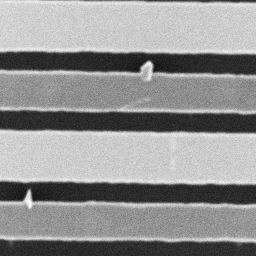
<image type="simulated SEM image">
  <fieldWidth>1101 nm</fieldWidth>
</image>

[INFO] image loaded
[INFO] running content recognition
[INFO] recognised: lines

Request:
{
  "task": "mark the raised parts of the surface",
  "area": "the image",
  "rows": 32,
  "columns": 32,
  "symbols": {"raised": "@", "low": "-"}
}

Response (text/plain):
@@@@@@@@@@@@@@@@@@@@@@@@@@@@@@@@
@@@@@@@@@@@@@@@@@@@@@@@@@@@@@@@@
@@@@@@@@@@@@@@@@@@@@@@@@@@@@@@@@
@@@@@@@@@@@@@@@@@@@@@@@@@@@@@@@@
@@@@@@@@@@@@@@@@@@@@@@@@@@@@@@@@
@@@@@@@@@@@@@@@@@@@@@@@@@@@@@@@@
--------------@@@-@@@@@@@@@@@@@@
--------------------------------
------------------@-------------
@@@@@@@@@@@@@@@@@@@@@@@@@@@@@@@@
@@@@@@@@@@@@@@@@@@@@@@@@@@@@@@@@
@@@@@@@@@@@@@@@@@@@@@@@@@@@@@@@@
@@@@@@@@@@@@@@@@@@@@@@@@@@@@@@@@
@@@@@@@@@@@@@@@@@@@@@@@@@@@@@@@@
--------------------------------
--------------------------------
@@@@@@@@@@----------------------
@@@@@@@@@@@@@@@@@@@@@@@@@@@@@@@@
@@@@@@@@@@@@@@@@@@@@@@@@@@@@@@@@
@@@@@@@@@@@@@@@@@@@@@@@@@@@@@@@@
@@@@@@@@@@@@@@@@@@@@@@@@@@@@@@@@
@@@@@@@@@@@@@@@@@@@@@@@@@@@@@@@@
@@@@@@@@@@@@@@@@@@@@@@@@@@@@@@@@
--------------------------------
---@----------------------------
@@@@@@@@@@@@@@@@@@@@@@@@@@@@@---
@@@@@@@@@@@@@@@@@@@@@@@@@@@@@@@@
@@@@@@@@@@@@@@@@@@@@@@@@@@@@@@@@
@@@@@@@@@@@@@@@@@@@@@@@@@@@@@@@@
@@@@@@@@@@@@@@@@@@@@@@@@@@@@@@@@
--------------------------------
--------------------------------